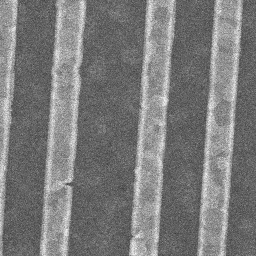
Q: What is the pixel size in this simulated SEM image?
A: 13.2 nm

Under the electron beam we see one or a few lines or trenches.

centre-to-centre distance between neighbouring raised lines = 1030 nm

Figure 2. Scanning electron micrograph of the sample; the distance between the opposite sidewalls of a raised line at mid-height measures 286 nanometres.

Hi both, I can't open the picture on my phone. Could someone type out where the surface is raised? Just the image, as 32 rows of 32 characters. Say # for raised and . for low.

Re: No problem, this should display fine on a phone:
##......##.........##......###..
##......##.........##......###..
##.....###.........##......###..
##.....###.........##......###..
##.....###.........##......###..
##.....###.........##......###..
#......###........###......###..
#......###........###......##...
#......###........###......##...
#......###........###......##...
#......###........###......##...
#......##.........###......##...
#......##.........###......##...
#......##.........###.....###...
#......##.........##......###...
#......##.........##......###...
#......##.........##......###...
#......##.........##......###...
#.....###.........##......###...
......###........###......###...
......###........###......###...
......###........###......##....
......###........###......##....
......##.........###......##....
......###........###......##....
......###........###......##....
......##.........###.....###....
......##.........###.....###....
......##.........##......###....
......##.........##......###....
......##.........##......###....
......##.........##......###....